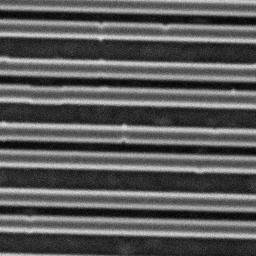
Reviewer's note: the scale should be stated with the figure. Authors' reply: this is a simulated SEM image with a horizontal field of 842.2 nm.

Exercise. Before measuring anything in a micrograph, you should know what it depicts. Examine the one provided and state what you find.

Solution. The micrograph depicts parallel lines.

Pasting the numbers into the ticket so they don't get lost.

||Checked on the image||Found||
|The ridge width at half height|0.0453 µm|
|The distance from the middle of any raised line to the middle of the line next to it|0.107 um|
